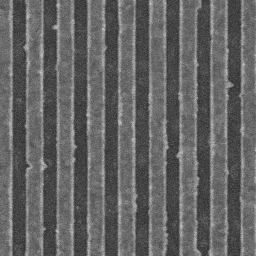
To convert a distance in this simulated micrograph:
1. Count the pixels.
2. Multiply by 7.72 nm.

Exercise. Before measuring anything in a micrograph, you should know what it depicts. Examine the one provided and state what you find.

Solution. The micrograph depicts parallel lines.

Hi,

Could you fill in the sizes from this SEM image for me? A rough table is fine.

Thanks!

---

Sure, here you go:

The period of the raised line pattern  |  238 nm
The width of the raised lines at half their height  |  123 nm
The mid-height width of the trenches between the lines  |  115 nanometers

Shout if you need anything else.